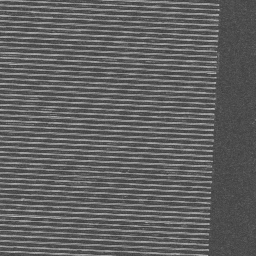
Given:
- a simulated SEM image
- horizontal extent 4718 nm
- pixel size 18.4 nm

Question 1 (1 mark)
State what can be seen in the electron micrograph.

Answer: parallel lines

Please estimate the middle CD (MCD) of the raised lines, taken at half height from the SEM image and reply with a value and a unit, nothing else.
23 nm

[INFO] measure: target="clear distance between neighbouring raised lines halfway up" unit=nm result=66.7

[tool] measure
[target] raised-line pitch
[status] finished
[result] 96.3 nm